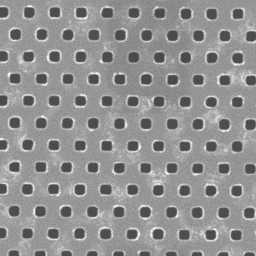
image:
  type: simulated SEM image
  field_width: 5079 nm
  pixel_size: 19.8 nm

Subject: a regular array of holes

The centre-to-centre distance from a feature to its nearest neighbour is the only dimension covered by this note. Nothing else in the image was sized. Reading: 502 nanometers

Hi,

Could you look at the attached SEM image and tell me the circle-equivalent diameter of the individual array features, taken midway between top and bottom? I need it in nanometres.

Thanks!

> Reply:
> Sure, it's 230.